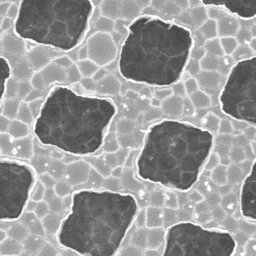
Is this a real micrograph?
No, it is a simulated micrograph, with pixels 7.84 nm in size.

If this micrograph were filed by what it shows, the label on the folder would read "holes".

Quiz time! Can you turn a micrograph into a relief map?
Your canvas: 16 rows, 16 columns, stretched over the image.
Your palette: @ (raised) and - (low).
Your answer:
@-----@@@@@@@@--
@----@@@---@@@@@
@@---@@@----@@@@
@@@@@@@@----@@@@
-@@@@@@@---@@@--
@@@@@@@@@@@@@@--
@@@----@@@@@@@--
@@-----@@@@@@@@-
@@----@@@----@@@
@@@@--@@@----@@@
--@@@@@@@---@@@@
--@@@@@@@@--@@@-
--@@@---@@@@@@@-
-@@@----@@@@@@@@
@@@@----@@@--@@@
@@@@---@@@-----@